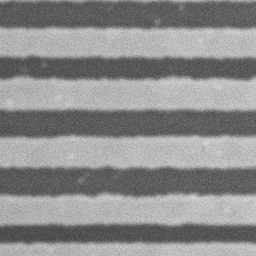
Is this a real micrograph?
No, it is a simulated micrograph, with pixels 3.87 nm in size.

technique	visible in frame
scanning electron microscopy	lines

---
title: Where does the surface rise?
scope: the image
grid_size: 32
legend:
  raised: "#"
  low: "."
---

................................
................................
................................
................................
################################
################################
################################
................................
................................
................................
################################
################################
################################
################################
................................
................................
................................
################################
################################
################################
################################
................................
................................
................................
#......###...#........##..#.##.#
################################
################################
################################
................................
................................
###.############################
################################